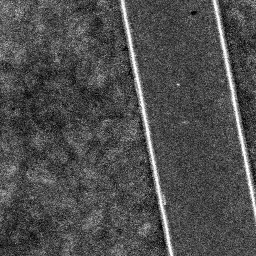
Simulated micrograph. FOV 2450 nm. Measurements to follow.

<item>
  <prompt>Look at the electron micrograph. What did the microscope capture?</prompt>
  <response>one or a few lines or trenches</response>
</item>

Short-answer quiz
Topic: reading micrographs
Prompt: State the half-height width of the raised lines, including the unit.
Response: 870 nanometers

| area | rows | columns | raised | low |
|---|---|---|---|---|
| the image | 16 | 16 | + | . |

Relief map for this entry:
........++++++..
........++++++..
........++++++..
........++++++..
.........+++++..
.........+++++..
.........++++++.
.........++++++.
.........++++++.
.........++++++.
..........+++++.
..........++++++
..........++++++
..........++++++
..........++++++
...........+++++